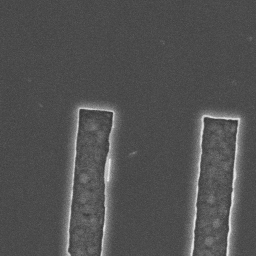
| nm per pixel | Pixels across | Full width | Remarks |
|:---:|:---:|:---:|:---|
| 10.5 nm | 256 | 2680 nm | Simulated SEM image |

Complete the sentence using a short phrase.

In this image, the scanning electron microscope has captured one or a few lines or trenches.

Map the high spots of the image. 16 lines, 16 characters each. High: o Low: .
oooooooooooooooo
oooooooooooooooo
oooooooooooooooo
oooooooooooooooo
oooooooooooooooo
oooooooooooooooo
oooooooooooooooo
ooooo..oooooo..o
ooooo..oooooo..o
ooooo..oooooo..o
ooooo..ooooo...o
ooooo..ooooo...o
oooo...ooooo...o
oooo...ooooo..oo
oooo..oooooo..oo
oooo..oooooo..oo